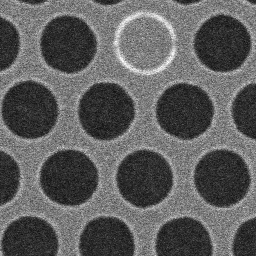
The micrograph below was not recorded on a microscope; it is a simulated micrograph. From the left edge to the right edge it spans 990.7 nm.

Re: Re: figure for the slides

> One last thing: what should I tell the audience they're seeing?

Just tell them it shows a regular array of holes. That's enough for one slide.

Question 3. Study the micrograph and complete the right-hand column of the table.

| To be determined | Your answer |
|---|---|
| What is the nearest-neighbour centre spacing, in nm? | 294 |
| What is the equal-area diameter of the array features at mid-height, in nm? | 224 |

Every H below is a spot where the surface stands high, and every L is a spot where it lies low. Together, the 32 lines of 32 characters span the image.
HHHLLHHHHHHHLLLHHHHHHHHLHHHHHHHL
HHHHHHHHHHHHHHHHHHHHHHHHHHHHHHHH
LHHHHHLLLLHHHHHHHHHHHHHHHHLLLLHH
LLHHHLLLLLLHHHHHHHHHHHHHHLLLLLLH
LLHHHLLLLLLLHHHHHHHHHHHHLLLLLLLH
LLLHHLLLLLLLHHHHHHHHHHHHLLLLLLLL
LLHHHLLLLLLLHHHHHHHHHHHHLLLLLLLH
LLHHHLLLLLLLHHHHHHHHHHHHHLLLLLLH
LHHHHHLLLLLHHHHHHHHHHHHHHHLLLLHH
HHHHHHHHHHHHHHHHHHHHHHHHHHHHHHHH
HHLLLHHHHHHHLLLHHHHHHHLLHHHHHHHL
HLLLLLHHHHHLLLLLHHHHLLLLLLHHHHLL
LLLLLLLHHHLLLLLLLHHHLLLLLLHHHLLL
LLLLLLLHHHLLLLLLLHHLLLLLLLLHHLLL
LLLLLLLHHHLLLLLLLHHLLLLLLLLHHLLL
HLLLLLLHHHLLLLLLHHHHLLLLLLHHHLLL
HLLLLLHHHHHLLLLLHHHHHLLLLLHHHHLL
HHHHHHHHHHHHLLHHHHHHHHHHHHHHHHHH
HHHHHHHHHHHHHHHHHHHHHHHHHHHHHHHH
LHHHHHLLLLLHHHHHLLLLHHHHHLLLLLHH
LLHHHLLLLLLLHHHLLLLLLHHHHLLLLLLH
LLLHHLLLLLLLHHHLLLLLLLHHLLLLLLLH
LLLHHLLLLLLLHHLLLLLLLLHHLLLLLLLH
LLHHHLLLLLLLHHHLLLLLLLHHLLLLLLLH
LLHHHHLLLLLLHHHLLLLLLHHHHLLLLLLH
LHHHHHHLLLHHHHHHLLLLHHHHHHLLLLHH
HHHHHHHHHHHHHHHHHHHHHHHHHHHHHHHH
HHLLLLHHHHHLLLLHHHHHHLLLLHHHHHHL
HLLLLLLHHHLLLLLLHHHHLLLLLLHHHHLL
LLLLLLLHHHLLLLLLLHHHLLLLLLHHHLLL
LLLLLLLHHHLLLLLLLHHLLLLLLLLHHLLL
LLLLLLLHHHLLLLLLLHHLLLLLLLLHHLLL